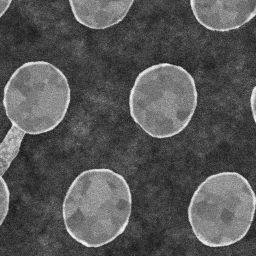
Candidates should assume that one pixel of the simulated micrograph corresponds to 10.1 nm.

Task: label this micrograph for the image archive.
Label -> raised bodies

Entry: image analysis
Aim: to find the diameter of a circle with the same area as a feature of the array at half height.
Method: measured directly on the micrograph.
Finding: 696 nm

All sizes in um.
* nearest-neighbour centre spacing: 1.25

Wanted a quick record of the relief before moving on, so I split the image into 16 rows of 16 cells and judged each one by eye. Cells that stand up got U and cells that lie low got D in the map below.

DDDDDUUUDDDDUUUU
DDDDDUUDDDDDDUUD
DDDDDDDDDDDDDDDD
DDDDDDDDDDDDDDDD
DUUUDDDDDUUUDDDD
UUUUDDDDUUUUDDDD
UUUUDDDDUUUUDDDD
DUUUDDDDUUUUDDDD
DDDDDDDDDDDDDDDD
DDDDDDDDDDDDDDDD
DDDDDDDDDDDDDDDD
DDDDDUUUDDDDDUUD
UDDDUUUUDDDDUUUU
DDDDUUUUDDDDUUUU
DDDDUUUDDDDDUUUD
DDDDDDDDDDDDDDDD